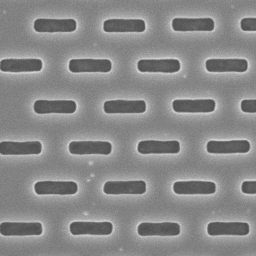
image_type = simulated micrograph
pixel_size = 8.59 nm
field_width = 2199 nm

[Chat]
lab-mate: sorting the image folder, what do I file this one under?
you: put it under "a regular array of holes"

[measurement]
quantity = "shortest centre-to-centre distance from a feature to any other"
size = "455 nm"